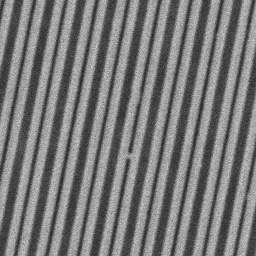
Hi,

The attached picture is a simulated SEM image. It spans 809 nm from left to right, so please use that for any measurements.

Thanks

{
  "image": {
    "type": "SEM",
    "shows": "parallel lines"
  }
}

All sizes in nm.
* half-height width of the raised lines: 26.7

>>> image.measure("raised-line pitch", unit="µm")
0.0483